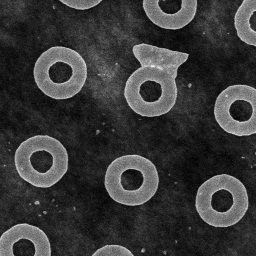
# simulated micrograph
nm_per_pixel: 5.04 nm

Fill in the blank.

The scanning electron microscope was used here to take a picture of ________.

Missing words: ring-shaped raised bodies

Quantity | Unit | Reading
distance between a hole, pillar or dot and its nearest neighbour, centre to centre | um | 0.463